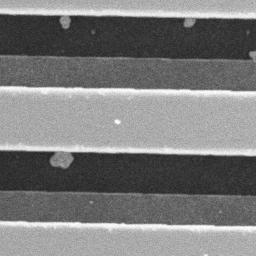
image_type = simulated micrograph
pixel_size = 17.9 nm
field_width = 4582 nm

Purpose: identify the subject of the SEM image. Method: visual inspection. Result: lines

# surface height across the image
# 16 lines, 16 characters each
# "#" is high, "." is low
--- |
################
................
................
................
################
################
################
################
################
......##########
................
................
################
################
################
################